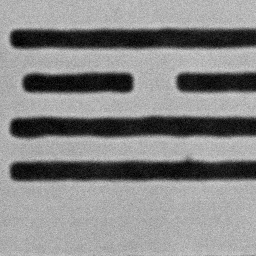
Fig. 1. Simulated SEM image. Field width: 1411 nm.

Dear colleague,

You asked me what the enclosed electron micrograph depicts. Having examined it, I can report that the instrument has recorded groups of lines, slits or small figures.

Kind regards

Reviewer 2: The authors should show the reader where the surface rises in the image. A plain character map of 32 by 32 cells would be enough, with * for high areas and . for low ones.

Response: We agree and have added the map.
********************************
********************************
********************************
********************.......***..
*...............................
*...............................
********************************
********************************
********************************
***..............*****..........
***..............*****..........
***.............*******.........
********************************
********************************
*****..***********.............*
*...............................
*...............................
********************************
********************************
********************************
*...............................
*...............................
**..............................
********************************
********************************
********************************
********************************
********************************
********************************
********************************
********************************
********************************